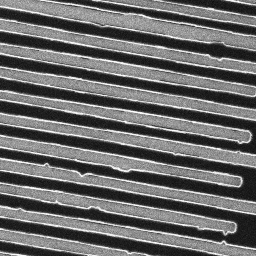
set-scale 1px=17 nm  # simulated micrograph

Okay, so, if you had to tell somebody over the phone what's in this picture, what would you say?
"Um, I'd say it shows parallel lines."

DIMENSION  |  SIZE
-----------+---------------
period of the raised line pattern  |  0.392 um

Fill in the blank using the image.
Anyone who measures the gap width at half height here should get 170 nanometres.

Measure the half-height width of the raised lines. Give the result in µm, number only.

0.216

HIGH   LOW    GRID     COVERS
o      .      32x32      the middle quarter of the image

oo................oooooooooooooo
oooooooo...............ooooooooo
oooooooooooo.................ooo
.oooooooooooooooooo.............
.......oooooooooooooooooo.......
.............oooooooooooooooooo.
oo.................ooooooooooooo
oooooooo.................ooooooo
oooooooooooooo.................o
..oooooooooooooooooo............
.......oooooooooooooooooooo.....
..............oooooooooooooooooo
ooooo................ooooooooooo
oooooooooo.................ooooo
oooooooooooooooo................
...oooooooooooooooooo...........
.........ooooooooooooooooo......
o................ooooooooooooooo
ooooooo................ooooooooo
ooooooooooooo...............oooo
ooooooooooooooooo...............
.....oooooooooooooooooo.........
...........oooooooooooooooooo...
.................ooooooooooooooo
oooooo...............ooooooooooo
oooooooooooo...............ooooo
.ooooooooooooo..ooo.............
....ooooooooooooooooooooo.......
...........oooooooooooooooooooo.
oo...............ooooooooooooooo
ooooooooo.............oooooooooo
ooooooooooooooo..............ooo